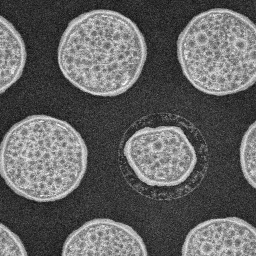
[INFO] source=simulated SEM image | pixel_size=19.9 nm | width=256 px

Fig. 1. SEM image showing raised bodies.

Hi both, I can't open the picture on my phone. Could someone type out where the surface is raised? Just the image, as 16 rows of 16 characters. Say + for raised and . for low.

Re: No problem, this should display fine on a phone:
................
.....+++....++++
+...+++++..+++++
+...+++++..+++++
+...+++++...++++
.....+++....+++.
................
..++............
+++++...++++...+
+++++...++++...+
+++++...++++...+
.++++...........
................
................
+....+++....++++
+...+++++...++++